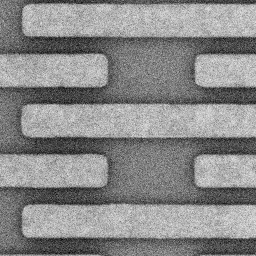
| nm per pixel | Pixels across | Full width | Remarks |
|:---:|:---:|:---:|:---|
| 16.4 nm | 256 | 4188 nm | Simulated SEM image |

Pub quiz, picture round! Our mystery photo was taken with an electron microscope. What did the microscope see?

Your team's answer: groups of lines, slits or small figures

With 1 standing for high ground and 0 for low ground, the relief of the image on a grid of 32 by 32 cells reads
00000111100000000000000000000000
00011111111111111111111111111111
00011111111111111111111111111111
00011111111111111111111111111111
00000000000000111101111111111111
00000000000000000000000000000000
00000000000000000000000000000000
11111111111110000000000011111111
11111111111110000000000011111111
11111111111110000000000011111111
11111111111110000000000001111111
00000000000000000000000000000000
00000000000000000000000000000000
00011111111111111111111111111111
00011111111111111111111111111111
00011111111111111111111111111111
00011111111111111111111111111111
00000000000000000000000000000000
00000000000000000000000000000000
11111111111110000000000001111111
11111111111110000000000011111111
11111111111110000000000011111111
11111111111110000000000011111111
00000000000000000000000000000000
00000000000000000000000000000000
00000000000000000000000000000000
00011111111111111111111111111111
00011111111111111111111111111111
00011111111111111111111111111111
00011111111111111111111111111111
00000000000000000000000000000000
00000000000000000000000000000000